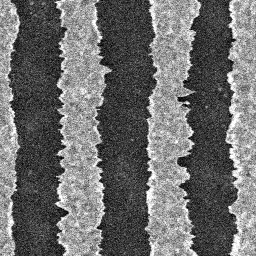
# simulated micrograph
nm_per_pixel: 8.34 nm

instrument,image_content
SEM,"one or a few lines or trenches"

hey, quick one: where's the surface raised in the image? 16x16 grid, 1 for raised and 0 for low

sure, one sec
1000110001110011
1000110000110001
1000110000110001
1000110000110011
1000111000110001
1000110000110001
1000110001100001
1000110001110001
1000110001110011
1000110001110001
1000110001100001
1000110001100001
1000110001110001
1000110001110001
1000110001110001
1000110001110001